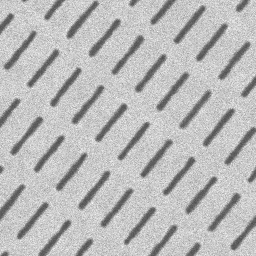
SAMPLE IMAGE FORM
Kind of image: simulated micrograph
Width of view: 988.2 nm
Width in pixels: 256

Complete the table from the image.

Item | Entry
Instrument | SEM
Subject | a regular array of holes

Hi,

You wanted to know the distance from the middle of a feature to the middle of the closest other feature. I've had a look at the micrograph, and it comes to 111 nm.